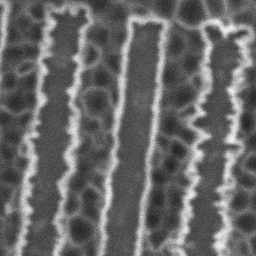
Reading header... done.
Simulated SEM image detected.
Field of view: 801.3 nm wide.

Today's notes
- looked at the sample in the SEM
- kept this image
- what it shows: one or a few lines or trenches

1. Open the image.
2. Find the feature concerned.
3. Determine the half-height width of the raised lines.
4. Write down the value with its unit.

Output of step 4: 150 nm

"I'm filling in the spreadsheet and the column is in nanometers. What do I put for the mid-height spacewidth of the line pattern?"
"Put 104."